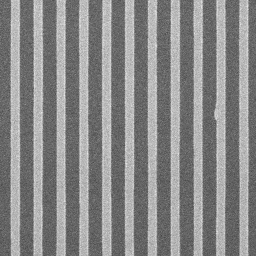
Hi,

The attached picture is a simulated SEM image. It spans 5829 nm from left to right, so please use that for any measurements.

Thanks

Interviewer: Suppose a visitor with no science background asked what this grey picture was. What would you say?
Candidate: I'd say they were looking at parallel lines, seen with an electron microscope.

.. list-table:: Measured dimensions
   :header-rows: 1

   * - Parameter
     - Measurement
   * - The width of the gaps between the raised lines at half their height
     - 339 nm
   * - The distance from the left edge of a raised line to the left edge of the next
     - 521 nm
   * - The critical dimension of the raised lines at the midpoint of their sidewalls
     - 185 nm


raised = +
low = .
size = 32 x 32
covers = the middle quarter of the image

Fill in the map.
....++....++...++....++....++...
....++....++...++....++....++...
....++....++...++....++....++...
....++....++...++....++....++...
....++....++...++....++....++...
....++....++...++....++....++...
....++....++...++....++....++...
....++....++...++....++....++...
....++....++...++....++....++...
....++....++...++....++....++...
....++....++...++....++....++...
....++....++...++....++....++...
....++....++...++....++....++...
....++....++...++....++....++...
....++....++....+....++....++...
....++....++....+....++....++...
....++....++....+....++....++...
....++....++....+....++....++...
....++....++....+....++....++...
....++....++....+....++....++...
....++....++...++....++....++...
....++....++...++....++....++...
....++....++...++....++....++...
....++....++...++....++....++...
....++....++...++....++....++...
....++....++...++....++....++...
....++....++...++....++....++...
....++....++...++....++....++...
....++....++...++....++....++...
....++....++...++....++....++...
....++....++...++....++....++...
....++....++...++....++....++...